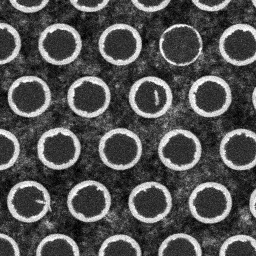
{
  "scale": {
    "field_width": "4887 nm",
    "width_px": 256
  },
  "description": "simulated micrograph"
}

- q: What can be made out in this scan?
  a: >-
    a regular array of raised bodies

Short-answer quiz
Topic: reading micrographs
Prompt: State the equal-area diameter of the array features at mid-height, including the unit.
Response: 742 nanometers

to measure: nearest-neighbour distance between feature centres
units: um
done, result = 1.14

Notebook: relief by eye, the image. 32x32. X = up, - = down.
--XXX----XXXX----XXXX----XXX----
--------------------------------
--------------------------------
X-----XXX-----XX-------------XX-
XX---XXXXX---XXXX-----------XXXX
XX---XXXXX---XXXX-----------XXXX
XX---XXXXX---XXXX-----------XXXX
X-----XXX-----XX-------------XXX
--------------------------------
--------------------------------
--XXX----XXXX----XXXX---XXXX----
-XXXXX---XXXXX--XXXXX---XXXXX---
-XXXXX---XXXX---XXXXX---XXXXX---
--XXXX---XXXX----XXXX---XXXX----
--------------------------------
--------------------------------
------XXX-----XX------X------XX-
XX---XXXXX---XXXX---XXXXX---XXXX
XX---XXXXX---XXXX---XXXXX---XXXX
XX---XXXXX---XXXX---XXXXX---XXXX
X-----XXX-----XXX----XXX-----XXX
--------------------------------
--------------------------------
--XXX----XXXX----XXX-----XXX----
-XXXXX---XXXXX--XXXXX---XXXXX---
-XXXXX---XXXXX--XXXXX---XXXXX--X
--XXXX---XXXX----XXXX---XXXX----
------------------X------XX-----
--------------------------------
X---------------------X---------
XX---XXXX----XXXX---XXXXX---XXXX
XX---XXXXX---XXXX---XXXXX---XXXX